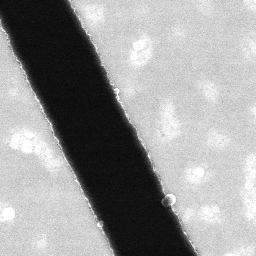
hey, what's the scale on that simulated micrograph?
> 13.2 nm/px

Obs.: one or a few lines or trenches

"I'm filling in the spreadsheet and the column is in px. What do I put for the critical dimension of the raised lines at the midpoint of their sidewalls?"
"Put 75.1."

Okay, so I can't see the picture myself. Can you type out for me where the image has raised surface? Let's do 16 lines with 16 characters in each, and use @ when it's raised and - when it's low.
@@@@@-----------
@@@@@-----------
@@@@@@----------
-@@@@@----------
-@@@@@@---------
--@@@@@---------
--@@@@@@--------
---@@@@@--------
---@@@@@@-------
----@@@@@-------
----@@@@@@------
-----@@@@@------
-----@@@@@@-----
------@@@@@-----
------@@@@@@----
-------@@@@@----